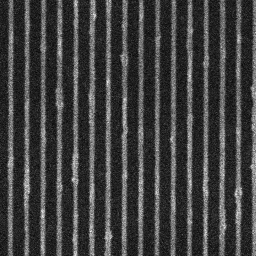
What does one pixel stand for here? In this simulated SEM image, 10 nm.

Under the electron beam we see parallel lines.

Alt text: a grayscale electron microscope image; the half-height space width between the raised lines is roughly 124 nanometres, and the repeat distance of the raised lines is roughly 0.163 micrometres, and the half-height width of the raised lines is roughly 43.9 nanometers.